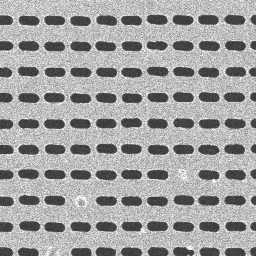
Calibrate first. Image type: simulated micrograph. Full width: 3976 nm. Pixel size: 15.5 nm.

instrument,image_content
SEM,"a regular array of holes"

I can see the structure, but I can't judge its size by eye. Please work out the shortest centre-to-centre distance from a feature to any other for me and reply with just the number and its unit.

0.393 µm